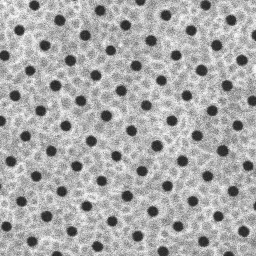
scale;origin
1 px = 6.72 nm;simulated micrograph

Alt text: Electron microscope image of a regular array of holes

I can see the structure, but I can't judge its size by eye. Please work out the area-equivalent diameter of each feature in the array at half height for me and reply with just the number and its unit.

74.3 nanometers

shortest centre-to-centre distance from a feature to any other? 196 nanometres